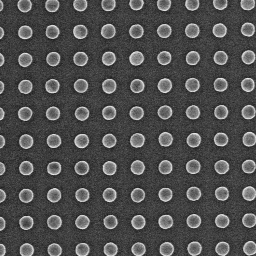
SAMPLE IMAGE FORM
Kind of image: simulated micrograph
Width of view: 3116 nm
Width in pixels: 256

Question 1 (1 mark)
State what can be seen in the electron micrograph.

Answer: a regular array of raised bodies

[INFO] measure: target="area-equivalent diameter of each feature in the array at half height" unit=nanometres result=166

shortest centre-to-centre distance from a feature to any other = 329 nm